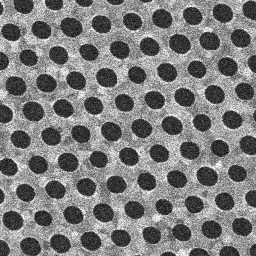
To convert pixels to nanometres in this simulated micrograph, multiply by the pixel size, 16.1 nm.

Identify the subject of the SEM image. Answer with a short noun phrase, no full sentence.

a regular array of holes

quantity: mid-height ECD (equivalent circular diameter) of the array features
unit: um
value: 0.316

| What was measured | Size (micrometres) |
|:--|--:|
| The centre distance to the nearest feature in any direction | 0.488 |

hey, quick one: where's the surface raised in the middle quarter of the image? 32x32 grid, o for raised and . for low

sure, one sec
oooooooooooooooooooooooo....ooo.
ooooooooo...oooo....ooo.....ooo.
o....ooo.....ooo.....oo.....ooo.
o....ooo.....ooo.....ooo....oooo
o.....oo.....oooo...oooooo.ooooo
o....oooo....ooooooooooooooooooo
ooo.oooooooooooooooooooooooo...o
oooooooooooooo.ooooo....oooo....
oooooo..ooooo....ooo.....oo.....
..ooo....oooo.....oo.....ooo....
..ooo.....ooo....oooo....oooo...
..ooo.....oooo...ooooooooooooooo
..oooo...ooooooooooooooooooooooo
.oooooooooooooooooooooooo...oooo
ooooooooooo.ooooo....ooo.....ooo
oo...oooo.....ooo.....oo......oo
oo....ooo......oo.....ooo.....oo
oo.....oo......oo.....oooo...ooo
oo.....ooo....ooooo..ooooooooooo
ooo...oooooooooooooooooooooooo..
oooooooooooooooooooooo...oooo...
oooooooooooooo....ooo.....ooo...
..ooooo...oooo.....oo.....ooo...
...ooo.....ooo.....ooo....oooo..
....ooo....ooo....ooooo..ooooooo
....ooo...oooooo.ooooooooooooooo
...oooooooooooooooooooooooo..ooo
ooooooooooooooooooo...oooo....oo
ooooo.ooooo....ooo.....ooo.....o
ooo....oooo.....oo.....ooo.....o
ooo.....ooo.....ooo....oooo...oo
.oo.....ooo....ooooo..oooooooooo